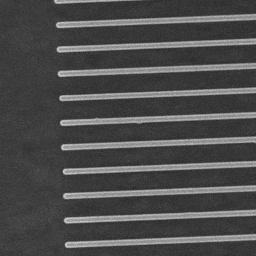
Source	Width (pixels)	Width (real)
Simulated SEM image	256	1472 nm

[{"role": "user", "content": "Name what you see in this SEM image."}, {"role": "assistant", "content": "parallel lines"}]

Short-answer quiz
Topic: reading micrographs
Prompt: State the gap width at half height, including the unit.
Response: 111 nm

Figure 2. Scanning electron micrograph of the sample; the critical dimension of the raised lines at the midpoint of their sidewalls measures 0.0266 microns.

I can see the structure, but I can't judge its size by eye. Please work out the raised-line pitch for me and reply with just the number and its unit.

0.141 µm